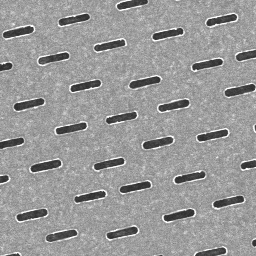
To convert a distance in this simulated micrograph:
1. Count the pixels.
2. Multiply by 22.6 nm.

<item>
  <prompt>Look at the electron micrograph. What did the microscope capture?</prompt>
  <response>a regular array of holes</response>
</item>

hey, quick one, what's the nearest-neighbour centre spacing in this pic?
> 0.959 um